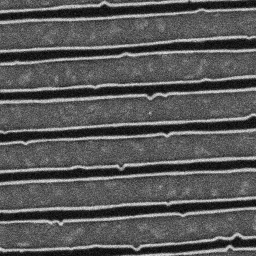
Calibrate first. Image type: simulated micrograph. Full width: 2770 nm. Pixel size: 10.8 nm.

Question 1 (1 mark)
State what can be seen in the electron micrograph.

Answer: parallel lines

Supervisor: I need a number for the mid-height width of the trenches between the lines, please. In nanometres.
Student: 302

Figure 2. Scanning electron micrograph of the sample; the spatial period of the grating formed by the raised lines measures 40.1 px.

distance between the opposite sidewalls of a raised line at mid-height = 127 nm